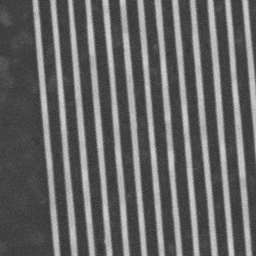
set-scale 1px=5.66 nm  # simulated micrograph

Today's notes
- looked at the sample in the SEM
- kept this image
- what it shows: parallel lines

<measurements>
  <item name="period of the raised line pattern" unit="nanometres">98.5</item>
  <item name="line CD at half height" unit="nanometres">21.1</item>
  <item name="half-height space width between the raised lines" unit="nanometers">73.9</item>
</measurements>